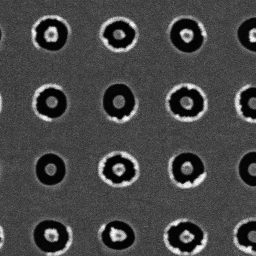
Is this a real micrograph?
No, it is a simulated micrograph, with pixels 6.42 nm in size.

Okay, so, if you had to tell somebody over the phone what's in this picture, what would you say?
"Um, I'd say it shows a regular array of ring-shaped grooves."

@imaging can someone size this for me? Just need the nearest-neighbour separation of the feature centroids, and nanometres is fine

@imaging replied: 427